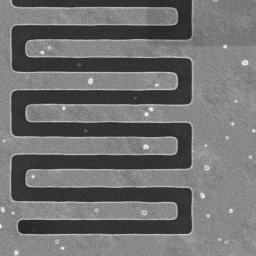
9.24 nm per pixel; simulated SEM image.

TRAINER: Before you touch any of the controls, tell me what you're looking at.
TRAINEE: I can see groups of lines, slits or small figures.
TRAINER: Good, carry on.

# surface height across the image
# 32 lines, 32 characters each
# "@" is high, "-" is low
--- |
@@----------------------@@@@@@@@
@@@@@@@@@@@@@@@@@@@@@@--@@@@@@@@
@@@@@@@@@@@@@@@@@@@@@@--@@@@@@@@
@@----------------------@@@@@@@@
@-----------------------@@@@@@@@
@--@@@@@@@@@@@@@@@@@@@@@@@@@@@@@
@--@@@@@@@@@@@@@@@@@@@@@@@@@@@@@
@-----------------------@@@@@@@@
@@----------------------@@@@@@@@
@@@@@@@@@@@@@@@@@@@@@@--@@@@@@@@
@@@@@@@@@@@@@@@@@@@@@@--@@@@@@@@
@@----------------------@@@@@@@@
@-----------------------@@@@@@@@
@--@@@@@@@@@@@@@@@@@@@@@@@@@@@@@
@--@@@@@@@@@@@@@@@@@@@@@@@@@@@@@
@-----------------------@@@@@@@@
@@----------------------@@@@@@@@
@@@@@@@@@@@@@@@@@@@@@@--@@@@@@@@
@@@@@@@@@@@@@@@@@@@@@@--@@@@@@@@
@@----------------------@@@@@@@@
@-----------------------@@@@@@@@
@--@@@@@@@@@@@@@@@@@@@@@@@@@@@@@
@--@@@@@@@@@@@@@@@@@@@@@@@@@@@@@
@----------------------@@@@@@@@@
@-----------------------@@@@@@@@
@@@@@@@@@@@@@@@@@@@@@@--@@@@@@@@
@@@@@@@@@@@@@@@@@@@@@@--@@@@@@@@
@@@---------------------@@@@@@@@
@@----------------------@@@@@@@@
@@@@@@@@@@@@@@@@@@@@@@@@@@@@@@@@
@@@@@@@@@@@@@@@@@@@@@@@@@@@@@@@@
@@@@@@@@@@@@@@@@@@@@@@@@@@@@@@@@